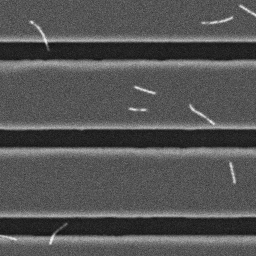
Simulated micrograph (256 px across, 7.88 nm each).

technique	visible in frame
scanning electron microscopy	lines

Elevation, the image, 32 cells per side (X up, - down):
XXXXXXXXXXXXXXXXXXXXXXXXXXXXXXXX
XXXXXXXXXXXXXXXXXXXXXXXXXXXXXXXX
XXXXXXXXXXXXXXXXXXXXXXXXXXXXXXXX
XXXXXXXXXXXXXXXXXXXXXXXXXXXXXXXX
XXXXXXXXXXXXXXXXXXXXXXXXXXXXXXXX
--------------------------------
--------------------------------
-----------------XX----------XX-
XXXXXXXXXXXXXXXXXXXXXXXXXXXXXXXX
XXXXXXXXXXXXXXXXXXXXXXXXXXXXXXXX
XXXXXXXXXXXXXXXXXXXXXXXXXXXXXXXX
XXXXXXXXXXXXXXXXXXXXXXXXXXXXXXXX
XXXXXXXXXXXXXXXXXXXXXXXXXXXXXXXX
XXXXXXXXXXXXXXXXXXXXXXXXXXXXXXXX
XXXXXXXXXXXXXXXXXXXXXXXXXXXXXXXX
XXXXXXXXXXXXXXXXXXXXXXXXXXXXXXXX
--------------------------------
--------------------------------
--X------XX-XX-----------X------
XXXXXXXXXXXXXXXXXXXXXXXXXXXXXXXX
XXXXXXXXXXXXXXXXXXXXXXXXXXXXXXXX
XXXXXXXXXXXXXXXXXXXXXXXXXXXXXXXX
XXXXXXXXXXXXXXXXXXXXXXXXXXXXXXXX
XXXXXXXXXXXXXXXXXXXXXXXXXXXXXXXX
XXXXXXXXXXXXXXXXXXXXXXXXXXXXXXXX
XXXXXXXXXXXXXXXXXXXXXXXXXXXXXXXX
XXXXXXXXXXXXXXXXXXXXXXXXXXXXXXXX
--------------------------------
--------------------------------
X-----X---------XXXX----X----X--
XXXXXXXXXXXXXXXXXXXXXXXXXXXXXXXX
XXXXXXXXXXXXXXXXXXXXXXXXXXXXXXXX